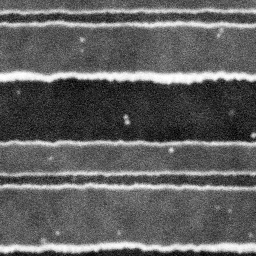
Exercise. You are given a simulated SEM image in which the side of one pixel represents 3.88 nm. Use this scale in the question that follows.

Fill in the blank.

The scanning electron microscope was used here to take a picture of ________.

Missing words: lines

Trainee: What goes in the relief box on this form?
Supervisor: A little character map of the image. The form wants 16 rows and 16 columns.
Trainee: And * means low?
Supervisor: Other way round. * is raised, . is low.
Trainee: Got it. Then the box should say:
****************
****************
****************
****************
****************
................
................
................
................
****************
****************
****************
****************
****************
****************
******...*******